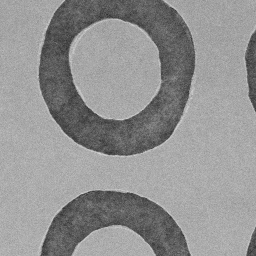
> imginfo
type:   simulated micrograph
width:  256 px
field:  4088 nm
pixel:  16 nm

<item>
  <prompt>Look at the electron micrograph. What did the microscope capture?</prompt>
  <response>ring-shaped grooves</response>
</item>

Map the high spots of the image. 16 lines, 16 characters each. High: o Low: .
oooo.......ooooo
ooo...oo....oooo
ooo..oooo...oooo
ooo.oooooo..ooo.
oo..oooooo..ooo.
oo...ooooo..oooo
ooo..oooo...oooo
ooo........ooooo
oooo.......ooooo
oooooo...ooooooo
oooooooooooooooo
oooooooooooooooo
ooooo....ooooooo
ooo........ooooo
ooo...oo...ooooo
ooo..oooo...ooo.